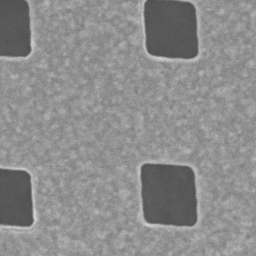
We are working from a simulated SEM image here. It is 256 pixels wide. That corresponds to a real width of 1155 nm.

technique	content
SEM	holes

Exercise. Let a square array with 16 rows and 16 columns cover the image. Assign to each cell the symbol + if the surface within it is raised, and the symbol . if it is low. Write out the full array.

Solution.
..+++++++...++++
..+++++++...++++
..+++++++...++++
.+++++++++..++++
++++++++++++++++
++++++++++++++++
++++++++++++++++
++++++++++++++++
++++++++++++++++
++++++++++++++++
+++++++++...++++
..+++++++...++++
..+++++++...++++
..+++++++...++++
++++++++++++++++
++++++++++++++++